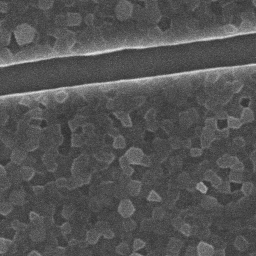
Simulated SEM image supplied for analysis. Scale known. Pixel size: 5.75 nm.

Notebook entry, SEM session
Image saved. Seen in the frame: one or a few lines or trenches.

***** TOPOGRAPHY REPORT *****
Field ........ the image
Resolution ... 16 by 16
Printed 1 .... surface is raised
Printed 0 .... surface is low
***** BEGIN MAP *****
1111111111111111
1111111111111111
1111111111111000
1111000000000000
0000000000001111
0000111111111111
1111111111111111
1111111111111111
1111111111111111
1111111111111111
1111111111111111
1111111111111111
1111111111111111
1111111111111111
1111111111111111
1111111111111111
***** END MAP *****